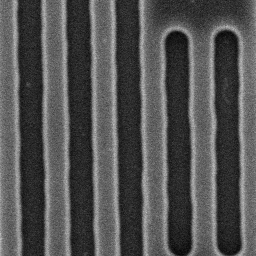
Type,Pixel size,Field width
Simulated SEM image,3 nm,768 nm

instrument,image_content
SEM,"groups of lines, slits or small figures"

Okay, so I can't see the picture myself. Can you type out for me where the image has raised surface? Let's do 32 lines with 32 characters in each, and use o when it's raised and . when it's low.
oo...ooo...ooo....oooooooooooooo
oo...ooo...ooo....oooooooooooooo
oo...ooo...ooo....oooooooooooooo
oo...ooo....oo....oooooooooooooo
oo...ooo....oo....ooo..oooo...oo
oo...ooo....oo....oo....ooo...oo
oo...ooo....oo....oo....ooo...oo
oo...ooo....oo....oo....oo....oo
oo....oo....oo....oo....ooo...oo
oo....oo....oo....oo....ooo...oo
oo....oo....oo....oo....ooo...oo
oo....oo....oo....oo....ooo...oo
oo....oo....oo....ooo...ooo...oo
oo....oo....oo....ooo...ooo...oo
oo....oo....oo....ooo...ooo...oo
oo....oo....oo....ooo...ooo...oo
oo....oo....oo....ooo...ooo...oo
oo....oo....oo....ooo...ooo...oo
oo....oo....oo....ooo...ooo...oo
oo....oo....oo....ooo...ooo...oo
oo....oo....oo....ooo...ooo...oo
oo....oo....oo....ooo...ooo...oo
oo....oo....oo....ooo...ooo...oo
oo....oo....ooo...ooo...ooo...oo
oo....oo....ooo...ooo...ooo...oo
oo....oo....ooo...ooo...ooo...oo
oo....oo....ooo...ooo...ooo...oo
oo....ooo...ooo...ooo...ooo...oo
oo....ooo...ooo...ooo...ooo...oo
oo....oo....ooo...ooo...ooo...oo
oo....ooo...ooo...ooo...ooo...oo
oo....ooo...ooo...ooo...ooo...oo